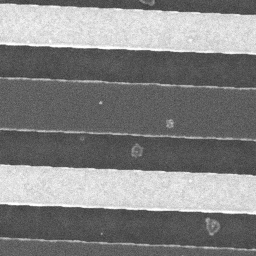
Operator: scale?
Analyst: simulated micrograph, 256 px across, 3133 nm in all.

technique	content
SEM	lines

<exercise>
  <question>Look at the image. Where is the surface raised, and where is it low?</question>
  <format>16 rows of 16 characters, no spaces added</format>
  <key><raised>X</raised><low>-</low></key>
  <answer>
XXXXX-----------
XXXXXXXXXXXXXXXX
XXXXXXXXXXXXXXXX
----------------
----------------
XXXXXXXXXXXXXXX-
XXXXXXXXXXXXXXXX
XXXXXXXXXXXXXXXX
---------XXXXXXX
----------------
XXXXX-----------
XXXXXXXXXXXXXXXX
XXXXXXXXXXXXXXXX
----------------
----------------
XXXXXXXXXXXXXX--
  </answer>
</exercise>